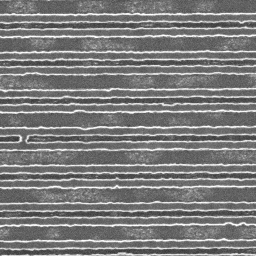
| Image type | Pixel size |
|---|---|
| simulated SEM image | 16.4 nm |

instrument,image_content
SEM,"parallel lines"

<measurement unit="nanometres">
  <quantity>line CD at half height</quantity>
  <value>134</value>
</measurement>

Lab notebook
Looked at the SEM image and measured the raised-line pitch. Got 310 nm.